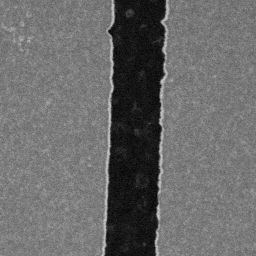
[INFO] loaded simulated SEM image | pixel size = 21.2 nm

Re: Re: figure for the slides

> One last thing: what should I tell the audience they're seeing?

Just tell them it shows one or a few lines or trenches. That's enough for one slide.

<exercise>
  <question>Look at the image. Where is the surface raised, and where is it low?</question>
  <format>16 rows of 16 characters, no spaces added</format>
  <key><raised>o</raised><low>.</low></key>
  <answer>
ooooooo...oooooo
ooooooo...oooooo
ooooooo...oooooo
ooooooo...oooooo
ooooooo...oooooo
ooooooo...oooooo
ooooooo...oooooo
ooooooo...oooooo
ooooooo...oooooo
ooooooo...oooooo
ooooooo...oooooo
ooooooo...oooooo
ooooooo...oooooo
ooooooo...oooooo
ooooooo...oooooo
oooooo....oooooo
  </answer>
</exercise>